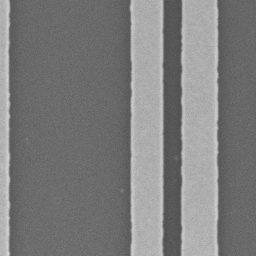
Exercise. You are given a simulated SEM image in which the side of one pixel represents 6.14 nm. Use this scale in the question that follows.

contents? lines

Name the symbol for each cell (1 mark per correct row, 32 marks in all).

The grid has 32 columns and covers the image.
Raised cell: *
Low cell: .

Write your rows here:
*...............****...****.....
*...............****...****.....
*...............****...****.....
*...............****...****.....
*...............****...****.....
*...............****...****.....
*...............****...****.....
*...............****...****.....
*................***...****.....
*................***...****.....
*...............****...****.....
*...............****...****.....
*...............****...****.....
*...............****...****.....
*...............****...****.....
*...............****...****.....
*...............****...****.....
*...............****...****.....
*...............****...****.....
*...............****...****.....
*...............****...****.....
*...............****...****.....
*...............****...****.....
*...............****...****.....
*...............****...****.....
*...............****...****.....
*...............****...****.....
*...............****...****.....
*................***...****.....
*................***...****.....
*...............****...****.....
*...............****...****.....